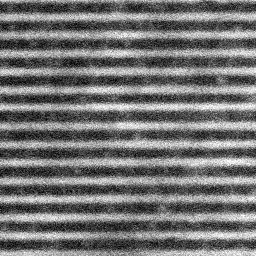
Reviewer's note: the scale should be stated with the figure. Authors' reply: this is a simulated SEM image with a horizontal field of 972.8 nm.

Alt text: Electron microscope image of parallel lines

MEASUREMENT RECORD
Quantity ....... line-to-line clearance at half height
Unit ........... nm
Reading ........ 46.1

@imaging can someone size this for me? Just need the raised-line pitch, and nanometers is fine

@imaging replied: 69.4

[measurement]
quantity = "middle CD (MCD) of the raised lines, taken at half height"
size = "0.0214 microns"